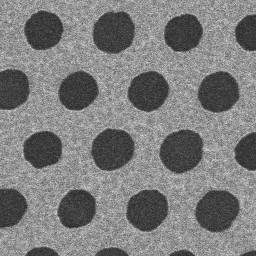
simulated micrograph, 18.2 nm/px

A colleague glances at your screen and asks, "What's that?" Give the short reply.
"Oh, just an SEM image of a regular array of holes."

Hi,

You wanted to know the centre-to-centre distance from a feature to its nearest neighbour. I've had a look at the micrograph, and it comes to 68.4 pixels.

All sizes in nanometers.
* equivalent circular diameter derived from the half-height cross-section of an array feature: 742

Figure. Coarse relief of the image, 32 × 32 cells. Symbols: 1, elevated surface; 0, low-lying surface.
11111111111111111111111111111111
11111011111111101111111111111111
11110000111100000111100001111100
11100000111100000111100001111000
11100000111100000111100001111000
11110001111100001111100001111100
11111111111110011111110111111111
11111111111111111111111111111111
11111111111111111111111111111111
00011111000011111000111111000111
00001111000011110000011110000011
00001110000011110000011110000011
00011110000011110000011110000011
00111111000111111000111110000111
11111111111111111111111111111111
11111111111111111111111111111111
11111011111110001111110011111111
11100000111100000111000001111100
11100000111000000111000001111000
11100000111000000111000001111000
11110001111100001111000001111100
11111111111111111111110111111111
11111111111111111111111111111111
11111111111111111111111111111111
00011111000011111000011110000111
00011110000011110000011110000011
00011110000011110000011100000011
00011110000111110000111110000111
11111111111111111000111110000111
11111111111111111111111111111111
11111111111111111111111111111111
11100001111100001111110011111110